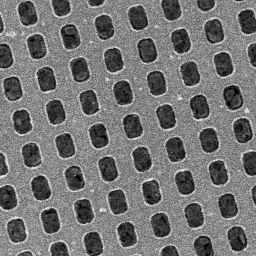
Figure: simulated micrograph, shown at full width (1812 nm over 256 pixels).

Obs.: a regular array of holes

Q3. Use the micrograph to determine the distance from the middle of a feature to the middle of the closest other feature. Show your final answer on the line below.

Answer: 242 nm